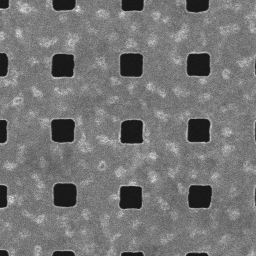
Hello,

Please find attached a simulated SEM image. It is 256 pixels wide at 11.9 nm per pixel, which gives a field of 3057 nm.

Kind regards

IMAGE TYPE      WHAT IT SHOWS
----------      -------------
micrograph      a regular array of holes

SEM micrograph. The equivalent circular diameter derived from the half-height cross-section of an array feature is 305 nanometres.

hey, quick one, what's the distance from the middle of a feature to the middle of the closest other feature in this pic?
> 781 nm